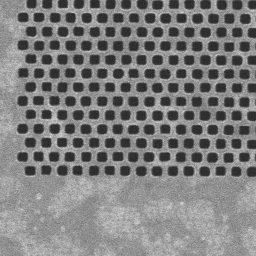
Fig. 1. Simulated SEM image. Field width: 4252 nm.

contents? a regular array of holes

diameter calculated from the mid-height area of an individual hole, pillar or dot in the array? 11.2 px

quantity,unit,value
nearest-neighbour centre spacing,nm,258